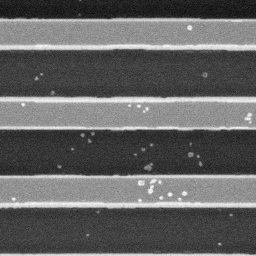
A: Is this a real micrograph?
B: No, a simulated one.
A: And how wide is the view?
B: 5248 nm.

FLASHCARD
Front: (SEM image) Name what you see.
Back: lines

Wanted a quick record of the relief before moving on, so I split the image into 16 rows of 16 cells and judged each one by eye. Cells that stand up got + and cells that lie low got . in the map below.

................
++++++++++++++++
++++++++++++++++
................
................
................
++++++++++++++++
++++++++++++++++
................
................
................
++++++++++++++++
++++++++++++++++
................
................
................